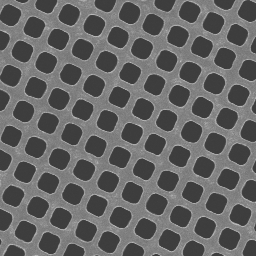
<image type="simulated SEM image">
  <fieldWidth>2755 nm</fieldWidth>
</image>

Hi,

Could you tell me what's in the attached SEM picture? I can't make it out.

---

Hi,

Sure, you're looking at a regular array of holes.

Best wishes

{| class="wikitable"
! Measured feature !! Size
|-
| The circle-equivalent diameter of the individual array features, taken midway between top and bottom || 224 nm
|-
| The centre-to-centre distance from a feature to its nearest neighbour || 283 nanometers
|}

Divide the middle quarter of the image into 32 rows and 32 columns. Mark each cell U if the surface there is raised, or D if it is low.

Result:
DDDUUUUUDDDDDUUDDDUUUUUDDDDDUUDD
DDDDUUUUUDDDUUDDDDDUUUUUUDDUUDDD
DDDDUUUUUUUUUUDDDDDUUUUUUUUUUDDD
DDDDUUDDDUUUUUDDDDDUUDDDDUUUUDDD
DDDUUDDDDDUUUUUUDDUUDDDDDUUUUUUD
UUUUUDDDDDUUUUUUUUUUDDDDDUUUDUUU
UUUUUDDDDDUUDDDDUUUUDDDDDUUDDDDU
DUUUUUDDDUUUDDDDDUUUUUDDUUDDDDDD
DDUUUUUUUUUDDDDDUUUUUUUUUUDDDDDU
DUUDDDUUUUUDDDDDUUDDDDUUUUUDDDDU
DUDDDDDUUUUUUDDUUDDDDDUUUUUUDDUU
UUDDDDDUUUUUUUUUUDDDDDUUUUUUUUUU
UUDDDDDUUDDDDUUUUDDDDDUUDDDDUUUU
UUUDDDUUUDDDDDUUUUUDDUUDDDDDUUUU
UUUUUUUUDDDDDUUUUUUUUUUDDDDDUUUD
DDDUUUUUDDDDDUUDDDDUUUUDDDDDUUDD
DDDDUUUUUUDDUUUDDDDDUUUUUDDUUDDD
DDDDDUUUUUUUUUDDDDDDUUDUUUUUUDDD
DDDDUUDDDUUUUUDDDDDUUDDDDUUUUUDD
DDDDUUDDDDDUUUUUDDDUDDDDDUUUUUUD
UUUUUDDDDDDUUUUUUUUUDDDDDUUUDUUU
UUUUUDDDDDUUDDDDUUUUUDDDDUUDDDDU
DUUUUUUDDDUUDDDDDUUUUUDDUUUDDDDD
DDUUUUUUUUUDDDDDDUUUUUUUUUDDDDDU
DUUDDDDUUUUDDDDDUUDDDDUUUUUDDDDU
DUUDDDDDUUUUUDDDUUDDDDDUUUUUDDUU
UUDDDDDDUUUUUUUUUDDDDDDUUUUUUUUU
UUDDDDDUUDDDDUUUUUDDDDUUDDDDUUUU
UUUDDDDUUDDDDDUUUUUDDDUUDDDDDUUU
UUUUUUUUDDDDDDUUDUUUUUUDDDDDDUUD
UDDDUUUUDDDDDUUDDDDUUUUUDDDDUUDD
DDDDDUUUUUDDDUUDDDDDUUUUUDDUUUDD